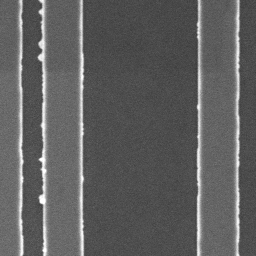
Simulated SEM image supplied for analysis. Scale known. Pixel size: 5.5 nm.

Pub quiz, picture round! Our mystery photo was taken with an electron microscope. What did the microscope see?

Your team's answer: lines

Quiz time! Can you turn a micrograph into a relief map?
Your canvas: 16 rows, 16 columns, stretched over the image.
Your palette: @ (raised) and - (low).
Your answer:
@--@@-------@@@-
@--@@-------@@@-
@--@@-------@@@-
@--@@-------@@@-
@--@@-------@@@-
@--@@-------@@@-
@--@@-------@@@-
@--@@-------@@@-
@--@@-------@@@-
@--@@-------@@@-
@--@@-------@@@-
@--@@-------@@@-
@--@@-------@@@-
@--@@-------@@@-
@--@@-------@@@-
@--@@-------@@@-